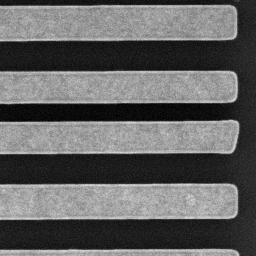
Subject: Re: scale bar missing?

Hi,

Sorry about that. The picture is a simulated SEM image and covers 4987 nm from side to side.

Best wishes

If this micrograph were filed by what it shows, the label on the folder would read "wiring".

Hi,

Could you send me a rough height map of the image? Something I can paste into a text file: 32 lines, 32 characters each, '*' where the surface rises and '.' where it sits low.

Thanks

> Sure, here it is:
................................
******************************..
******************************..
******************************..
*****************************...
................................
................................
................................
................................
******************************..
******************************..
******************************..
*****************************...
................................
................................
******************************..
******************************..
******************************..
*****************************...
................................
................................
................................
................................
*****************************...
******************************..
******************************..
******************************..
................................
................................
................................
................................
******************************..